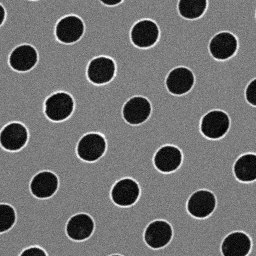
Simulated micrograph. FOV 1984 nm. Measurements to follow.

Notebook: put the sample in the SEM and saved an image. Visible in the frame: a regular array of holes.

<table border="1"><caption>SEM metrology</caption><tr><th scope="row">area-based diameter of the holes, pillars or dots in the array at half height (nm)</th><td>217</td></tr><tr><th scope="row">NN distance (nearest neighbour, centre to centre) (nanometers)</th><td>411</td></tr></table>